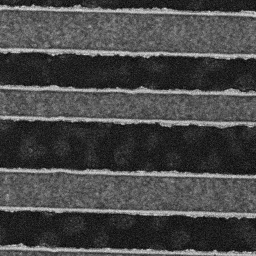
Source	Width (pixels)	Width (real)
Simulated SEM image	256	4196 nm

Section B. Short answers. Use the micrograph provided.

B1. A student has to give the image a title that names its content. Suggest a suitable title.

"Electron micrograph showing one or a few lines or trenches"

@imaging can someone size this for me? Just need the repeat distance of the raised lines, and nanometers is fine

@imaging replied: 1310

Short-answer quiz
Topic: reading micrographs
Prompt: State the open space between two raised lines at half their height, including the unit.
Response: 612 nm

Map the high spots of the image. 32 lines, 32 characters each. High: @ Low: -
@@@@@@@@@@@@@@@@@@@@@@@@@@@@@@@@
------------------@---@@@@@@@@@@
--------------------------------
--------------------------------
--------------------------------
--------------------------------
@@@@@@@@@@@---------------------
@@@@@@@@@@@@@@@@@@@@@@@@@@@@@@@@
@@@@@@@@@@@@@@@@@@@@@@@@@@@@@@@@
@@@@@@@@@@@@@@@@@@@@@@@@@@@@@@@@
@@@@@@@@@@@@@@@@@@@@@@@@@@@@@@@@
--------------------@--@@@@@@@@@
--------------------------------
--------------------------------
--------------------------------
@@@@@@@@@@@@@@@@@@@@@@@@@@@@@@--
@@@@@@@@@@@@@@@@@@@@@@@@@@@@@@@@
@@@@@@@@@@@@@@@@@@@@@@@@@@@@@@@@
@@@@@@@@@@@@@@@@@@@@@@@@@@@@@@@@
@@@@@@@@@@@@@@@@@@@@@@@@@@@@@@@@
@@@@@@@@@@@@@@@@@@@@@@@@@@@@@@@@
---------@@@@@@@@@@@@@@@@@@@@@@@
--------------------------------
--------------------------------
--------------------------------
--------------------------------
@@@@@@@@@@@@@@@@@@--------------
@@@@@@@@@@@@@@@@@@@@@@@@@@@@@@@@
@@@@@@@@@@@@@@@@@@@@@@@@@@@@@@@@
@@@@@@@@@@@@@@@@@@@@@@@@@@@@@@@@
@@@@@@@@@@@@@@@@@@@@@@@@@@@@@@@@
------------------@@@@@@@@@@@@@@